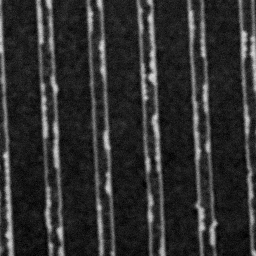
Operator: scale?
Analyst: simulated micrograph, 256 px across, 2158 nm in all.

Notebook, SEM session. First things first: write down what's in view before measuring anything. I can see parallel lines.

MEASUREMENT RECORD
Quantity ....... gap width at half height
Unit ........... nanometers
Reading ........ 309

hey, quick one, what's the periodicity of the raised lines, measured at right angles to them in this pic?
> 0.426 um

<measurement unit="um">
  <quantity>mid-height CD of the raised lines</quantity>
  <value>0.114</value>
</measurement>